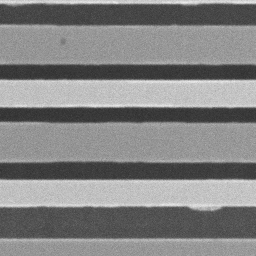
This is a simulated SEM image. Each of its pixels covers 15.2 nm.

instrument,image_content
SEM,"lines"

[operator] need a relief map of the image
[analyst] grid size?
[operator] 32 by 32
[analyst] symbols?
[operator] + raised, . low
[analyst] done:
................................
................................
................................
++++++++++++++++++++++++++++++++
++++++++++++++++++++++++++++++++
++++++++++++++++++++++++++++++++
++++++++++++++++++++++++++++++++
++++++++++++++++++++++++++++++++
................................
................................
++++++++++++++++++++++++++++++++
++++++++++++++++++++++++++++++++
++++++++++++++++++++++++++++++++
................................
................................
++++++++++++++++++++++++++++++++
++++++++++++++++++++++++++++++++
++++++++++++++++++++++++++++++++
++++++++++++++++++++++++++++++++
++++++++++++++++++++++++++++++++
................................
................................
................................
++++++++++++++++++++++++++++++++
++++++++++++++++++++++++++++++++
++++++++++++++++++++++++++++++++
................................
................................
................................
................................
++++++++++++++++++++++++++++++++
++++++++++++++++++++++++++++++++